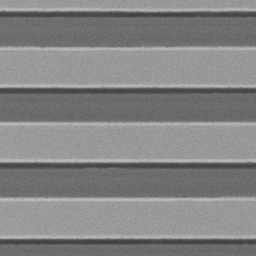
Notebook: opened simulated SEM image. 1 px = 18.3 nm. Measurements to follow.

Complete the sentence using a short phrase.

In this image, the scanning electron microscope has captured lines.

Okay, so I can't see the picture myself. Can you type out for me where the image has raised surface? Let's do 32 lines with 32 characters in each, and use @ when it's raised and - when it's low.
@@@@@@@@@@@@@@@@@@@@@@@@@@@@@@@@
--------------------------------
--------------------------------
--------------------------------
--------------------------------
--------------------------------
@@@@@@@@@@@@@@@@@@@@@@@@@@@@@@@@
@@@@@@@@@@@@@@@@@@@@@@@@@@@@@@@@
@@@@@@@@@@@@@@@@@@@@@@@@@@@@@@@@
@@@@@@@@@@@@@@@@@@@@@@@@@@@@@@@@
@@@@@@@@@@@@@@@@@@@@@@@@@@@@@@@@
--------------------------------
--------------------------------
--------------------------------
--------------------------------
@@@@@@@@@@@@@@@@@@@@@@@@@@@@@@@@
@@@@@@@@@@@@@@@@@@@@@@@@@@@@@@@@
@@@@@@@@@@@@@@@@@@@@@@@@@@@@@@@@
@@@@@@@@@@@@@@@@@@@@@@@@@@@@@@@@
@@@@@@@@@@@@@@@@@@@@@@@@@@@@@@@@
--------------------------------
--------------------------------
--------------------------------
--------------------------------
--------------------------------
@@@@@@@@@@@@@@@@@@@@@@@@@@@@@@@@
@@@@@@@@@@@@@@@@@@@@@@@@@@@@@@@@
@@@@@@@@@@@@@@@@@@@@@@@@@@@@@@@@
@@@@@@@@@@@@@@@@@@@@@@@@@@@@@@@@
@@@@@@@@@@@@@@@@@@@@@@@@@@@@@@@@
--------------------------------
--------------------------------